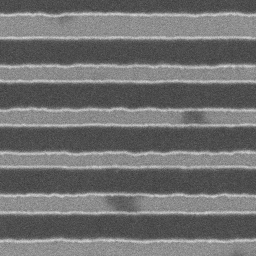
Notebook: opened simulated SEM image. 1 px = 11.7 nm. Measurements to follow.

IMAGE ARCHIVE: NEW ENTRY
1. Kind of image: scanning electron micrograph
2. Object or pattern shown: lines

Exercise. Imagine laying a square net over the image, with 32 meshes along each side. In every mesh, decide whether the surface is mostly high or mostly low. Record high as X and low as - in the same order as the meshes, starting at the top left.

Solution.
XXXXXXXXXXXXXXXXXXXXXXXXXXXXXXXX
XXXXXXXXXXXXXXXXXXXXXXXXXXXXXXXX
--------------------------------
--------------------------------
--------------------------------
XXXXXXXXXXXXXXXXXXXXXXXXXXXXXXXX
XXXXXXXXXXXXXXXXXXXXXXXXXXXXXXXX
XXXXXXXXXXXXXXXXXXXXXXXXXXXXXXXX
--------------------------------
--------------------------------
XXXXXXXXXXXXXXXXXXXXXXXXXXXXXXXX
XXXXXXXXXXXXXXXXXXXXXXXXXXXXXXXX
XXXXXXXXXXXXXXXXXXXXXXXXXXXXXXXX
XXXXXXXXXXXXXXXXXXXXXXXXXXXXXXXX
--------------------------------
--------------------------------
XXXXXXXXXXXXXXXXXXXXXXXXXXXXXXXX
XXXXXXXXXXXXXXXXXXXXXXXXXXXXXXXX
XXXXXXXXXXXXXXXXXXXXXXXXXXXXXXXX
--------------------------------
--------------------------------
XXXXXXXXXXXXXXXXXXXXXXXXXXXXXXXX
XXXXXXXXXXXXXXXXXXXXXXXXXXXXXXXX
XXXXXXXXXXXXXXXXXXXXXXXXXXXXXXXX
XXX--X-XXX---------XX--XXXXX--XX
--------------------------------
--------------------------------
XXXXXXXXXXXXXXXXXXXXXXXXXXXXXXXX
XXXXXXXXXXXXXXXXXXXXXXXXXXXXXXXX
XXXXXXXXXXXXXXXXXXXXXXXXXXXXXXXX
--------------------------------
--------------------------------